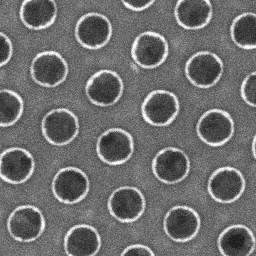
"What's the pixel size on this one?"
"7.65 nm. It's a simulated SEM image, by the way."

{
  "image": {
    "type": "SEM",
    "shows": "a regular array of raised bodies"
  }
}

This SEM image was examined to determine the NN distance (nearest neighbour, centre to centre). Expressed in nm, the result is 446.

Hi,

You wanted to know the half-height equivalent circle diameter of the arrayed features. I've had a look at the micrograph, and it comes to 271 nm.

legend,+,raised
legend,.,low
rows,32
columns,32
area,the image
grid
...++++.........+++...++++......
...++++...............++++......
...++++...+++.........++++...+++
....+.....++++.........++....+++
+.........++++...+++.........+++
+.........+++....++++.........++
+................++++...........
+...++++.........+++....+++.....
....++++...............+++++....
....++++....+++........++++....+
.....++....++++.........+++...++
+..........++++....++.........++
+++........++++...++++.........+
+++...............++++..........
++....+++.........++++...++++...
+....+++++.........++....++++...
.....+++++...+++.........++++...
......+++...++++.........+++....
............+++++...............
++++........++++....+++.........
++++...............+++++........
++++...+++.........++++....+++..
.++....++++.........+++...++++..
.......++++....++.........++++..
.......++++...++++........++++..
..............++++..............
..+++.........++++...+++........
.++++..........++....++++.......
.++++....+++.........++++....++.
..+++...++++.........+++....++++
........++++...............+++++
........++++...++++.........+++.